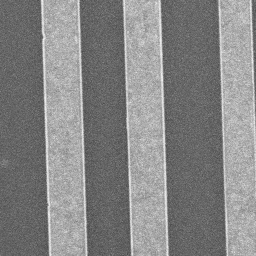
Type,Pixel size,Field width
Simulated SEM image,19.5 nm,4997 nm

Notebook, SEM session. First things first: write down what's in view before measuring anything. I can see one or a few lines or trenches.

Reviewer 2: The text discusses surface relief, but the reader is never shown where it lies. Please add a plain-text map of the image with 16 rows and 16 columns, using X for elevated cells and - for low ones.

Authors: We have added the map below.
---XX---XX----XX
---XX---XX----XX
---XX---XX----XX
---XX---XX----XX
---XX---XX----XX
---XX---XX----XX
---XX---XX----XX
---XX---XX----XX
---XX---XX----XX
---XX---XX----XX
---XX---XX----XX
---XX---XX----XX
---XX---XX----XX
---XX---XX----XX
---XX---XX----XX
---XX---XX----XX